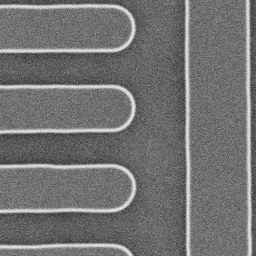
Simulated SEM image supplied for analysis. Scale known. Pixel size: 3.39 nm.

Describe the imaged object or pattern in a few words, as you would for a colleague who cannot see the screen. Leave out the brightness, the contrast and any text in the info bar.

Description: groups of lines, slits or small figures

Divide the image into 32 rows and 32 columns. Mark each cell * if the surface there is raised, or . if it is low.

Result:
.......................********.
****************.......********.
*****************......********.
*****************......********.
*****************......********.
****************.......********.
.......................********.
.......................********.
.......................********.
.......................********.
.......................********.
****************.......********.
*****************......********.
*****************......********.
*****************......********.
****************.......********.
****...................********.
.......................********.
.......................********.
.......................********.
........................*******.
****************........*******.
*****************.......*******.
*****************.......*******.
*****************.......*******.
****************........*******.
........................*******.
........................*******.
........................*******.
........................*******.
........................*******.
****************........*******.